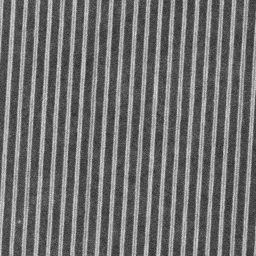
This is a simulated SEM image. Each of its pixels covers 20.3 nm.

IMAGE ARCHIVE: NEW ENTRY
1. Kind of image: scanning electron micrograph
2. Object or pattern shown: parallel lines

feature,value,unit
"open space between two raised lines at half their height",177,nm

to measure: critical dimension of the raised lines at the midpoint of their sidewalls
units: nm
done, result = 60.7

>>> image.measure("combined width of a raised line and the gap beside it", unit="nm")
248